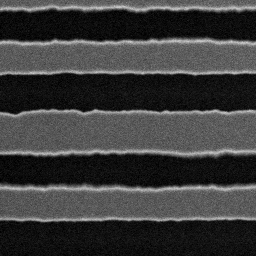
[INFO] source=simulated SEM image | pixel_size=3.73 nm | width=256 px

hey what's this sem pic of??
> lines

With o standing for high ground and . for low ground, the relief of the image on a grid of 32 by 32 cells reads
oooooooooooooooooooooooooooooooo
................................
................................
................................
................................
oooooooooooooooooooooooooooooooo
oooooooooooooooooooooooooooooooo
oooooooooooooooooooooooooooooooo
oooooooooooooooooooooooooooooooo
................................
................................
................................
................................
................................
oooooooooooooooooooooooooooooooo
oooooooooooooooooooooooooooooooo
oooooooooooooooooooooooooooooooo
oooooooooooooooooooooooooooooooo
oooooooooooooooooooooooooooooooo
................................
................................
................................
................................
ooooo.ooo.o...o......ooooooo.ooo
oooooooooooooooooooooooooooooooo
oooooooooooooooooooooooooooooooo
oooooooooooooooooooooooooooooooo
..o.ooooooooo...o..oo.o.........
................................
................................
................................
................................